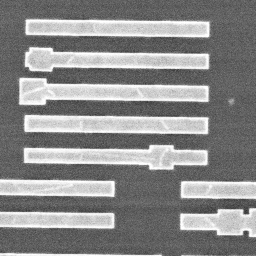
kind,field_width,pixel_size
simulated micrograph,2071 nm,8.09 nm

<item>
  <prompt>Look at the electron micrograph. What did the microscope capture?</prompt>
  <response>wiring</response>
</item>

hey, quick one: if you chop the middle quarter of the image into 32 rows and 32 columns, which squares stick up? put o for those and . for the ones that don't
oooooooooooooooooooooooooooooooo
................................
................................
................................
................................
ooooooooooooooooooooooooo.......
oooooooooooooooooooooooooooooooo
oooooooooooooooooooooooooooooooo
oooooooooooooooooooooooooooooooo
................................
................................
................................
................................
ooooooooooooooooooooooooooooooo.
oooooooooooooooooooooooooooooooo
oooooooooooooooooooooooooooooooo
oooooooooooooooooooooooooooooooo
................................
................................
................................
......................ooooo.....
oooooooooooooo.......ooooooo....
oooooooooooooooooooooooooooooooo
oooooooooooooooooooooooooooooooo
oooooooooooooooooooooooooooooooo
.....................oooooo.....
................................
................................
................................
oooooooooooo....................
oooooooooooo..................oo
oooooooooooo..................oo